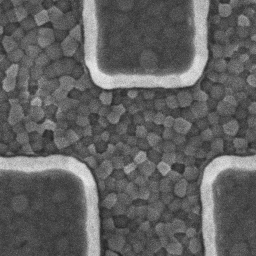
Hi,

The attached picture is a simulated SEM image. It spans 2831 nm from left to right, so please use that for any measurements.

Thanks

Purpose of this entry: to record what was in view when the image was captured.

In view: raised bodies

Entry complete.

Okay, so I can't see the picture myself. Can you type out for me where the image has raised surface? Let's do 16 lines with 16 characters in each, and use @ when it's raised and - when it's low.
------@@@@@@@---
------@@@@@@@---
------@@@@@@@---
------@@@@@@@---
------@@@@@@----
----------------
----------------
----------------
----------------
----------------
@@@@@--------@@@
@@@@@@-------@@@
@@@@@@-------@@@
@@@@@@-------@@@
@@@@@@-------@@@
@@@@@@-------@@@